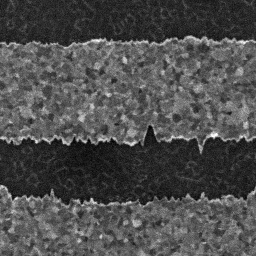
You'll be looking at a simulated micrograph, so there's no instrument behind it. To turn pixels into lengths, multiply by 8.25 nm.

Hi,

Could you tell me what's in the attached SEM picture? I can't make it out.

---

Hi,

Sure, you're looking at one or a few lines or trenches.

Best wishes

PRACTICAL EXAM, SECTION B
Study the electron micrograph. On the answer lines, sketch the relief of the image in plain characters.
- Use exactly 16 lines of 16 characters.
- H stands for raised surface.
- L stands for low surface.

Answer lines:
LLLLLLLLLLLLLLLL
LLLLLLLLLLLLLLLL
LLLLLLLLLLLHHLLL
HHHHHHHHHHHHHHHH
HHHHHHHHHHHHHHHH
HHHHHHHHHHHHHHHH
HHHHHHHHHHHHHHHH
HHHHHHHHHHHHHHHH
HHHHHHHHHLHHHHHH
LLLLLLLLLLLLLLLL
LLLLLLLLLLLLLLLL
LLLLLLLLLLLLLLLL
HHHHLLLLLLHHHLHH
HHHHHHHHHHHHHHHH
HHHHHHHHHHHHHHHH
HHHHHHHHHHHHHHHH